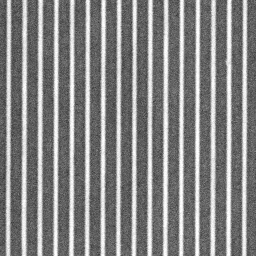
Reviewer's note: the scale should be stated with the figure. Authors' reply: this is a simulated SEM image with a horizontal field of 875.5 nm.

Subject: parallel lines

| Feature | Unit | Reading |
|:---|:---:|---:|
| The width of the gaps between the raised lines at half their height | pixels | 12.1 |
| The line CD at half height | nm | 12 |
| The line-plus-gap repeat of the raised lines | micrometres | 0.0538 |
